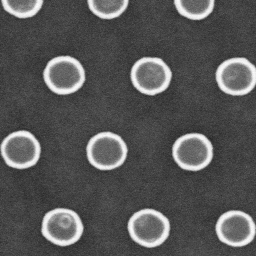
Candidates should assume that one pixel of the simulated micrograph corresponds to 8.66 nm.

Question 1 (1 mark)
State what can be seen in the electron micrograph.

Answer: a regular array of raised bodies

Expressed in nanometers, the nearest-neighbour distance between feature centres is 747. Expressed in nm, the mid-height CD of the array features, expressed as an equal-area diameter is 307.